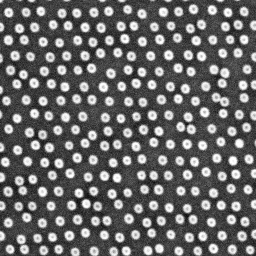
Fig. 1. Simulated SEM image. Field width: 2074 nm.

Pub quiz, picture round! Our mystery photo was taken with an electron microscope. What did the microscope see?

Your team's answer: a regular array of raised bodies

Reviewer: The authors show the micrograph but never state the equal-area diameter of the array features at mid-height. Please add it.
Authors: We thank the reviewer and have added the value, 0.062 microns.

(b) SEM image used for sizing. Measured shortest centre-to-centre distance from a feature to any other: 115 nanometres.